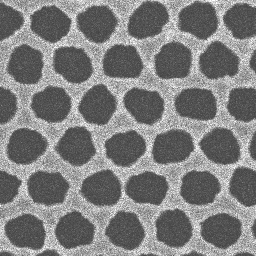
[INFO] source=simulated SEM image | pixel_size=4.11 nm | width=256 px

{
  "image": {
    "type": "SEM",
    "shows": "a regular array of holes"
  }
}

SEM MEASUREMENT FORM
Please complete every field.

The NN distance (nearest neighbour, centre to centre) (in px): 46.4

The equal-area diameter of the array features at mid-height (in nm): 155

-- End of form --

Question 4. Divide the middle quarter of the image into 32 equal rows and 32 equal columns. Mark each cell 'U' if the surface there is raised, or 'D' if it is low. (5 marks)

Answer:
DDDDDDDUUUDDDDDDDDDDUUUDDDDDDDDD
DDDDDDDUUUDDDDDDDDDDUUUDDDDDDDDU
DDDDDDDUUUDDDDDDDDDUUUUDDDDDDDDU
DDDDDDUUUUUUUUDDDDUUUUUUDDDDDDUU
UDDDDUUUUUUUUUUUUUUUUUUUUUUUUUUU
UUUUUUUDDDUUUUUUUUUUUUUUUUUUUUUU
UUUUUUDDDDDUUUUUDDDDUUUUUUUUUUDD
DUUUUDDDDDDDUUUDDDDDDDDDUUUUUDDD
DDUUUDDDDDDDDUUDDDDDDDDDDUUUDDDD
DDUUDDDDDDDDDUUDDDDDDDDDDUUUDDDD
DDUUDDDDDDDDDUUDDDDDDDDDDUUUDDDD
DDUUDDDDDDDDDUUUDDDDDDDDDUUUDDDD
DUUUDDDDDDDDUUUUUDDDDDDDDUUUUDDD
UUUUUDDDDDDDUUUUUUDDDDDDUUUUUUUD
UUUUUUDDDDDUUUUUUUDDDDDUUUUUUUUU
UUUUUUUUUUUUUUUUUUUUUUUUUUUUUUUU
UDDDDDUUUUUUUUUUUUUUUUUUUUUDDUUU
DDDDDDDUUUUUUDDDDDDUUUUUDDDDDDDU
DDDDDDDUUUUDDDDDDDDDUUUDDDDDDDDD
DDDDDDDUUUDDDDDDDDDDUUDDDDDDDDDD
DDDDDDDDUUDDDDDDDDDDDUDDDDDDDDDD
DDDDDDDDUUDDDDDDDDDDUUDDDDDDDDDD
DDDDDDDDUUUDDDDDDDDDUUDDDDDDDDDD
DDDDDDDUUUUDDDDDDDDUUUDDDDDDDDDU
UDDDDDUUUUUUDDDDDDUUUUUDDDDUDUUU
UUDUUUUUUUUUUUDDUUUUUUUUUUUUUUUU
UUUUUUUUUUDDUUUUUUUUUUUUUUUUUUUU
UUUUUUUDDDDDDUUUUUUDDDDUUUUUUUDD
UUUUUUDDDDDDDUUUDDDDDDDDDUUUUUDD
DUUUUDDDDDDDDDUUDDDDDDDDDDUUUDDD
DUUUDDDDDDDDDDUDDDDDDDDDDDUUUDDD
DUUUDDDDDDDDDDUDDDDDDDDDDDUUUDDD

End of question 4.